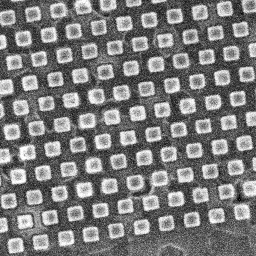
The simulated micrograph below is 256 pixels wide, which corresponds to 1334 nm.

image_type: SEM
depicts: a regular array of raised bodies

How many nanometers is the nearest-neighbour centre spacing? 132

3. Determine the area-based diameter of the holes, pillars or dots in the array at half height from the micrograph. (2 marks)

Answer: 78.2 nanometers